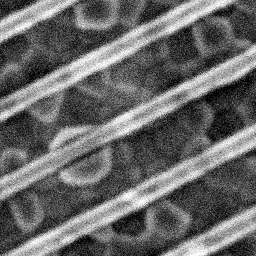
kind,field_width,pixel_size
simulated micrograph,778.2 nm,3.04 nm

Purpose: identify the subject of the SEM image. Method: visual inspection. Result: one or a few lines or trenches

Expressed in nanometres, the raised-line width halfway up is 45.6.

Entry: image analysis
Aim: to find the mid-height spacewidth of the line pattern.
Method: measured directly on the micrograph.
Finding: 0.168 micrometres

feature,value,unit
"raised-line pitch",214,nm